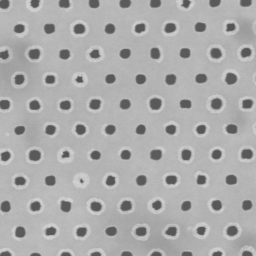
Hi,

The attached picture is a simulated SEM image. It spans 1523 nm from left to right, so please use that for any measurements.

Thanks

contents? a regular array of holes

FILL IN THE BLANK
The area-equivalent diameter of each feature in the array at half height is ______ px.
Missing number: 10.1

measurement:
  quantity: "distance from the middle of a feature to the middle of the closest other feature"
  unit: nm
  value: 174